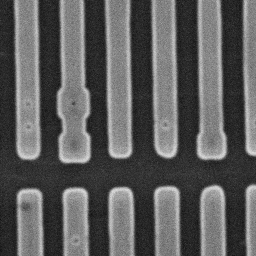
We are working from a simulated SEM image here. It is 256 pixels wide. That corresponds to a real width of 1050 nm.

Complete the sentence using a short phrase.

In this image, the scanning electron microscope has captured wiring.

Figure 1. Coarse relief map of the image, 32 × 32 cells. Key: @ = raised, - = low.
--@@@---@@---@@@---@@@---@@----@
--@@@---@@---@@@---@@@---@@----@
--@@@---@@---@@@---@@@---@@@---@
--@@@---@@---@@@---@@@---@@@---@
--@@@---@@---@@@---@@@---@@@---@
--@@@---@@---@@@---@@@---@@@---@
--@@@---@@---@@@---@@@---@@@---@
--@@@---@@---@@@---@@@---@@@---@
--@@@---@@---@@@---@@@---@@@---@
--@@@---@@@--@@@---@@@---@@@---@
--@@@---@@@--@@@---@@@---@@@---@
--@@@--@@@@--@@@---@@@---@@@---@
--@@@--@@@@---@@---@@@---@@@---@
--@@@--@@@@---@@---@@@---@@@---@
--@@@--@@@@---@@---@@@---@@@---@
--@@@---@@@---@@---@@@---@@@---@
--@@@---@@@---@@---@@@---@@@---@
--@@@--@@@@---@@---@@@---@@@---@
--@@@--@@@@---@@---@@@---@@@---@
---@@--@@@@---@@----@----@@@----
--------------------------------
--------------------------------
--------------------------------
--------------------@@----@----@
--@@@---@@@---@@@--@@@---@@@---@
--@@@---@@@---@@@--@@@---@@@---@
--@@@---@@@---@@@--@@@---@@@---@
--@@@---@@@---@@@--@@@---@@@---@
--@@@---@@@---@@@--@@@---@@@---@
--@@@---@@@---@@@--@@@---@@@---@
--@@@---@@@---@@@---@@---@@@---@
--@@@---@@@---@@@---@@---@@@---@